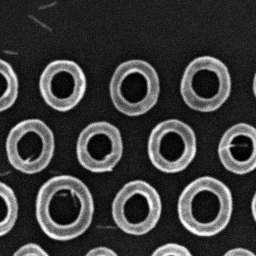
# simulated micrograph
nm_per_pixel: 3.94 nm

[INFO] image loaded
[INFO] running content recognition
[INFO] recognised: a regular array of ring-shaped raised bodies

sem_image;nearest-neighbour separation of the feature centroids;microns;0.272